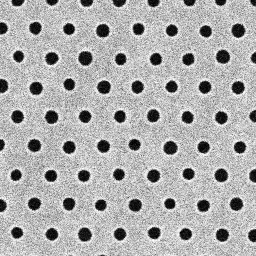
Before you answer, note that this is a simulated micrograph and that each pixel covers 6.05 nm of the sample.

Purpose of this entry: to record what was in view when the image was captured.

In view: a regular array of holes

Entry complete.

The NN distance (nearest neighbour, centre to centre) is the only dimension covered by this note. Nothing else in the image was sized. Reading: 197 nanometers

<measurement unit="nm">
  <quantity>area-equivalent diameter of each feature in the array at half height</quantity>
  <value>78.5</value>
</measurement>